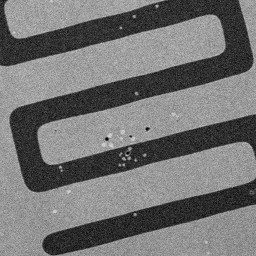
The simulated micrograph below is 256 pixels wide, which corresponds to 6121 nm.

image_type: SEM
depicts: groups of lines, slits or small figures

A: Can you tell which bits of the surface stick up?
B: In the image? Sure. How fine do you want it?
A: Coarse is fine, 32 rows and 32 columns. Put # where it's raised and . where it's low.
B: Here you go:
.##################...........##
.###############..............##
.##########.............###....#
.#######............########...#
..##............############...#
............################...#
.........###################....
....#####################.......
#####################..........#
#################............###
#############.............######
#########.............##########
#####.............##############
##............##################
#.........#####################.
#.....####################......
#....##################.........
##...##############.............
##...#########.............####.
##...######............#########
##.................#############
###.............################
###........####################.
###....#####################....
########################........
####################............
#################...........####
############.............#######
#########............###########
######...........###############
#####........###################
######...#######################